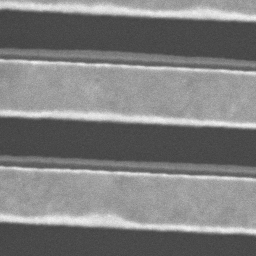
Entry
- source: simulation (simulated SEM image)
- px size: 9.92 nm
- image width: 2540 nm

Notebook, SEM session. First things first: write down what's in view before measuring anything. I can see lines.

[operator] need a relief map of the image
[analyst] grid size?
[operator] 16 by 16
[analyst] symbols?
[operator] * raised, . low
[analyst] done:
****************
................
................
................
****************
****************
****************
.......*********
................
................
**..............
****************
****************
****************
.............***
................